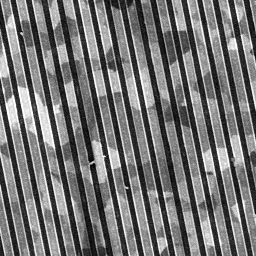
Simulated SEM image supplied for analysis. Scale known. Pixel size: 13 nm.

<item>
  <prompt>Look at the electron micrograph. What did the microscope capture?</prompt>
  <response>parallel lines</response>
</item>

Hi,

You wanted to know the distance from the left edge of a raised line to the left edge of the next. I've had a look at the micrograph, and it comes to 198 nm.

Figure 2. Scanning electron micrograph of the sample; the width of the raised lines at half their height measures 0.115 micrometres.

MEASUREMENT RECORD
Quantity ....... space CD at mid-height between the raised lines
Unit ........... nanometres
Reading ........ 81.2